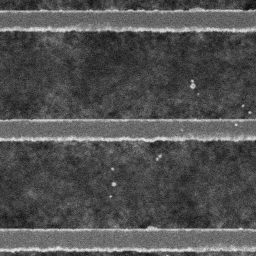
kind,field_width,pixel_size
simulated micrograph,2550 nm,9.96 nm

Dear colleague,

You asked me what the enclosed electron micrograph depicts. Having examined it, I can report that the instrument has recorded lines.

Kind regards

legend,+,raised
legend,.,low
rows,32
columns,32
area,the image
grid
................................
++++++++++++++++++++++++++++++++
++++++++++++++++++++++++++++++++
++++++++++++++++++++++++++++++++
................................
................................
................................
................................
................................
................................
................................
................................
................................
................................
................................
++++++++++++++++++++++++++++++++
++++++++++++++++++++++++++++++++
..................+.............
................................
................................
................................
................................
................................
................................
................................
................................
................................
................................
................................
++++++++++++++++++++++++++++++++
++++++++++++++++++++++++++++++++
................................